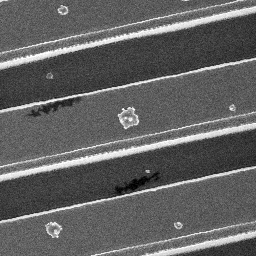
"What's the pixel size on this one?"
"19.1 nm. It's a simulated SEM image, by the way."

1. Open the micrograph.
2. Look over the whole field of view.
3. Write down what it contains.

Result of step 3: lines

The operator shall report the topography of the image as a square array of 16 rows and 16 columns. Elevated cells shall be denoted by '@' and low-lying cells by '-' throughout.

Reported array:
@@@@@@@@@@@@@@@@
@@@@@@@@@@@@----
@@@@@@@---------
@@@-------------
------------@@@@
-------@@@@@@@@@
--@@@@@@@@@@@@@@
@@@@@@@@@@@@@@@@
@@@@@@@@@@@@@---
@@@@@@@@--------
@@@-------------
-----------@@@@@
-------@@@@@@@@@
--@@@@@@@@@@@@@@
@@@@@@@@@@@@@@@@
@@@@@@@@@@@@----